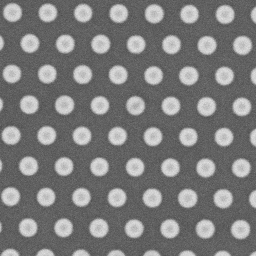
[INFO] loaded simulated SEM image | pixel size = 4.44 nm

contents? an array of small figures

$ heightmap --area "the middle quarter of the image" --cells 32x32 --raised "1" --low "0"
00001000000001000000000000000000
00011110000011100000011100000111
00111110000111110000111110000111
00011110000111110000111110000111
00011100000011100000011100000011
00000000000000000000000000000000
00000000000000000000000000000000
00000000000000000000000000000000
11000000110000000110000000110000
11000001111000001111000001111000
11000001111000001111000001111000
11000001111000001111000001111000
10000000000000000110000000110000
00000000000000000000000000000000
00000000000000000000000000000000
00000000000000000000000000000000
00011100000011100000011100000011
00111110000111110000111100000111
00111110000111110000111100000111
00011100000011100000111100000111
00000000000000000000000000000000
00000000000000000000000000000000
00000000000000000000000000000000
10000000000000000000000000000000
11000001111000001111000001110000
11000001111000001111000011111000
11000001111000001111000011111000
10000001110000001110000001110000
00000000000000000000000000000000
00000000000000000000000000000000
00000000000000000000000000000000
00011100000011000000011000000011